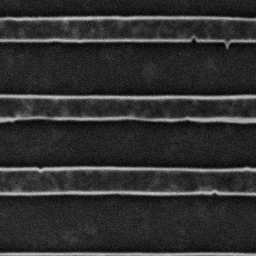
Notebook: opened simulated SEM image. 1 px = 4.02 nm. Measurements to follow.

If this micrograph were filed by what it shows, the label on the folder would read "one or a few lines or trenches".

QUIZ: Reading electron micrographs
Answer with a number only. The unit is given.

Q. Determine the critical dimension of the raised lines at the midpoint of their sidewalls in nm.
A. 90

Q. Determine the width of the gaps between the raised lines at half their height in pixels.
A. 56.3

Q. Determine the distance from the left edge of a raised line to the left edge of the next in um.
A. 0.306